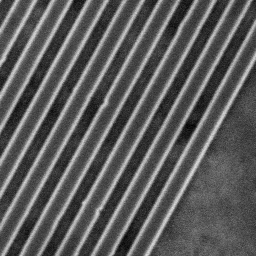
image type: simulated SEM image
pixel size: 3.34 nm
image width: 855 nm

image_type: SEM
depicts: parallel lines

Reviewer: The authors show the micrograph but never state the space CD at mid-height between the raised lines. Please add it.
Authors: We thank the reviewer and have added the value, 48.4 nm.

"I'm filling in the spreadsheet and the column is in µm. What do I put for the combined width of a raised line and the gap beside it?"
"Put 0.105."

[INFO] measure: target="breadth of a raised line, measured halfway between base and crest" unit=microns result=0.0571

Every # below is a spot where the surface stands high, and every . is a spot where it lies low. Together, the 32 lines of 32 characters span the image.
..##..###..##..###..##..###..##.
.###..##..###..##..###..##..###.
.##..###..##..###..##..###..##..
###..##..##...##..##..###..##..#
##..##...##..##...##..##...##..#
#...##..##..###..##..###..##..##
#..##...##..##..###..##..###..##
..###..##..###..##..###..##..###
..##..###..##..###..##..###..##.
.###..##..###..##..###..##..###.
.##..###..##..###..##..###..##..
###..##..###..##..###..##..###..
##..###..##..###..##..##...##...
##..##..###..##..###..##..##....
#..##...##..##...##..##...##....
#..##..##...##..##...##..##.....
..##..###..##..###..##..###.....
..##..##..###..##..###..##......
.##..###..##..###..##..###......
###..##..###..##..###..##.......
##..###..##..###..##..###.......
##..##..###..##..###..##........
#..###..##..###..##..###........
#..##..###..##..##...##.........
..##...##..###..##..###.........
..##..##..###..##...##..........
.##..###..##...##..##...........
###..##..###..##..###...........
##..###..##..###..##............
##..##..###..##..###............
#..###..##..###..##.............
#..##..###..##..###.............